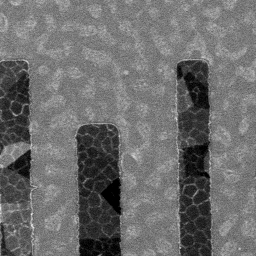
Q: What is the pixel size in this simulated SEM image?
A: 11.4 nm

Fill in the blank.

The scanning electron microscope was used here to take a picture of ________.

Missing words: one or a few lines or trenches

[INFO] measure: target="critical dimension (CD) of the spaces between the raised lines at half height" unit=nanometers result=551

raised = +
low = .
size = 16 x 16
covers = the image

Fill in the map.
................
................
................
................
++.........++...
++.........++...
++.........++...
++.........++...
++...++....++...
++...++....++...
++...++....++...
++...+++...++...
++...+++...++...
++...+++...++...
++...+++...++...
++...+++...++...